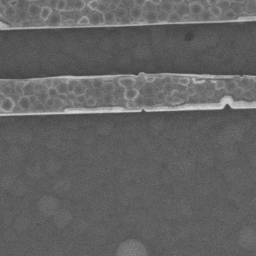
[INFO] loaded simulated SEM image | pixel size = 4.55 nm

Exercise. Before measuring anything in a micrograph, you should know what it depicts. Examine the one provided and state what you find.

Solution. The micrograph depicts one or a few lines or trenches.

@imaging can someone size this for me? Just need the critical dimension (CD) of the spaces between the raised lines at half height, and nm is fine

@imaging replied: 227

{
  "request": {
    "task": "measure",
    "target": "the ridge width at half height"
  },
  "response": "36.2 pixels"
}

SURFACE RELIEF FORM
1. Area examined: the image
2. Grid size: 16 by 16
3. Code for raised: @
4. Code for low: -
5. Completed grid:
@@@@@@@@@@@@@@@@
@@@@@@@@@@------
----------------
----------------
----------------
@@@@@@@@@@@@@@@@
@@@@@@@@@@@@@@@@
----------------
----------------
----------------
----------------
----------------
----------------
----------------
----------------
----------------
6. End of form